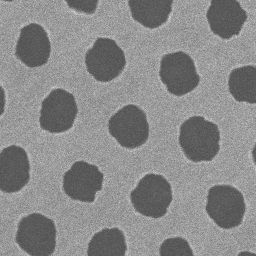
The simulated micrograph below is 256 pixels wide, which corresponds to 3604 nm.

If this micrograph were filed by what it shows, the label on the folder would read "a regular array of holes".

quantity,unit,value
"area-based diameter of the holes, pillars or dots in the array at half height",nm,588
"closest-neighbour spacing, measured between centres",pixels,70.1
